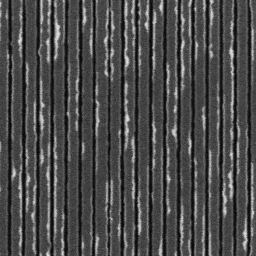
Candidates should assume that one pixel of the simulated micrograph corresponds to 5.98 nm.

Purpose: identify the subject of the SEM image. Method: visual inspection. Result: parallel lines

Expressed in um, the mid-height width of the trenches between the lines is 0.0217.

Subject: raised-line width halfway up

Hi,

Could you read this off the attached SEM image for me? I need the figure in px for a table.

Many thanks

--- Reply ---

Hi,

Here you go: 9.88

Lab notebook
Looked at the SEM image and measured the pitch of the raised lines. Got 84.3 nm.